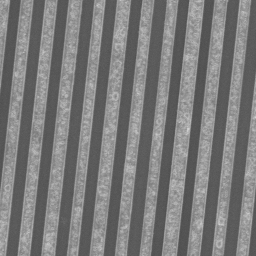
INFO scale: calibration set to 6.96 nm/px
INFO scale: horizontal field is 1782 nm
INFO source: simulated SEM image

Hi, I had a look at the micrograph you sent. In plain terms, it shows parallel lines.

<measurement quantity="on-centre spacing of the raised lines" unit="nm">168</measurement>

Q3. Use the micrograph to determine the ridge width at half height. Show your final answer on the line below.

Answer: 80.5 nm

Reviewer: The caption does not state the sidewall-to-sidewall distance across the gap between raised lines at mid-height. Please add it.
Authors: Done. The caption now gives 85.6 nanometers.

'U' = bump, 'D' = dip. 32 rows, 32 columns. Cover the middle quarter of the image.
UUUDDDUUDDDDUUUDDDUUUDDDUUUDDDUU
UUUDDDUUDDDDUUUDDDUUUDDDUUUDDDUU
UUDDDDUUDDDUUUUDDDUUDDDDUUDDDUUU
UUDDDDUUDDDUUUUDDDUUDDDDUUDDDUUU
UUDDDUUUDDDUUUDDDUUUDDDDUUDDDUUU
UUDDDUUUDDDUUUDDDUUUDDDDUUDDDUUU
UUDDDUUUDDDUUUDDDUUUDDDUUUDDDUUU
UUDDDUUUDDDUUUDDDUUUDDDUUUDDDUUU
UUDDDUUUDDDUUUDDDUUUDDDUUUDDDUUU
UUDDDUUDDDDUUUDDDUUUDDDUUUDDDUUU
UUDDDUUDDDDUUUDDDUUUDDDUUUDDDUUU
UDDDDUUDDDDUUUDDDUUDDDDUUDDDUUUU
UDDDDUUDDDUUUUDDDUUDDDDUUDDDUUUU
UDDDDUUDDDUUUDDDDUUDDDDUUDDDUUUU
UDDDUUUDDDUUUDDDUUUDDDDUUDDDUUUU
UDDDUUUDDDUUUDDDUUUDDDDUUDDDUUUU
UDDDUUUDDDUUUDDDUUUDDDUUUDDDUUUU
UDDDUUUDDDUUUDDDUUUDDDUUUDDDUUUD
UDDDUUDDDDUUUDDDUUUDDDUUUDDDUUUD
UDDDUUDDDDUUUDDDUUUDDDUUUDDDUUUD
DDDDUUDDDDUUUDDDUUDDDDUUDDDDUUUD
DDDDUUDDDUUUUDDDUUDDDDUUDDDUUUUD
DDDDUUDDDUUUDDDDUUDDDDUUDDDUUUUD
DDDUUUDDDUUUDDDUUUDDDDUUDDDUUUUD
DDDUUUDDDUUUDDDUUUDDDDUUDDDUUUUD
DDDUUUDDDUUUDDDUUUDDDUUUDDDUUUUD
DDDUUUDDDUUUDDDUUUDDDUUUDDDUUUDD
DDDUUUDDDUUUDDDUUUDDDUUUDDDUUUDD
DDDUUDDDDUUUDDDUUUDDDUUUDDDUUUDD
DDDUUDDDDUUUDDDUUDDDDUUDDDDUUUDD
DDDUUDDDUUUUDDDUUDDDDUUDDDUUUUDD
DDDUUDDDUUUUDDDUUDDDDUUDDDUUUUDD